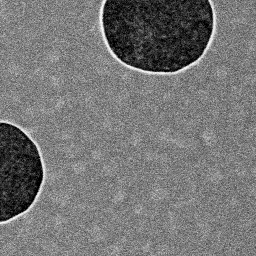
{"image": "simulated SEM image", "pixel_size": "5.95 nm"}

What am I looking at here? holes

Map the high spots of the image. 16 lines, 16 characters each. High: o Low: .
oooooo.......ooo
oooooo.......ooo
ooooooo......ooo
ooooooo......ooo
oooooooooo.ooooo
oooooooooooooooo
oooooooooooooooo
oooooooooooooooo
..oooooooooooooo
..oooooooooooooo
...ooooooooooooo
...ooooooooooooo
..oooooooooooooo
.ooooooooooooooo
oooooooooooooooo
oooooooooooooooo